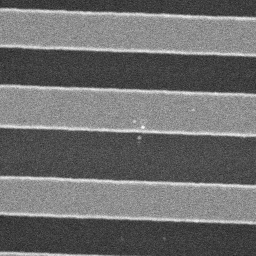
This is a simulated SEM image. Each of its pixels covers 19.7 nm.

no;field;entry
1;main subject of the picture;lines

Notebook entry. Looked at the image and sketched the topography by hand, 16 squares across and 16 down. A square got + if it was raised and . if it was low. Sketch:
................
++++++++++++++++
++++++++++++++++
................
................
++++............
++++++++++++++++
++++++++++++++++
................
................
................
+++++++++++++...
++++++++++++++++
...+++++++++++++
................
................